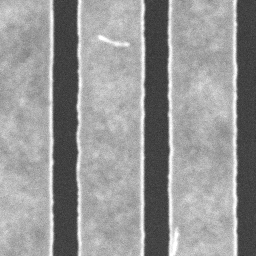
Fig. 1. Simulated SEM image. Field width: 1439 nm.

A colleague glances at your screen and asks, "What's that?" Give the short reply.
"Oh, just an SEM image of lines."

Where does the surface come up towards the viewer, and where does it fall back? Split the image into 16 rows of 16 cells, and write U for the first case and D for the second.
UUUDDUUUUDDUUUUD
UUUDDUUUUDDUUUUD
UUUDDUUUUDDUUUUD
UUUDDUUUUDDUUUUD
UUUDDUUUUDDUUUUD
UUUDDUUUUDDUUUUD
UUUDDUUUUDDUUUUD
UUUDDUUUUDDUUUUD
UUUDDUUUUDDUUUUD
UUUDDUUUUDDUUUUD
UUUDDUUUUDDUUUUD
UUUDDUUUUDDUUUUD
UUUDDUUUUDDUUUUD
UUUDDUUUUDDUUUUD
UUUDDUUUUDDUUUUD
UUUDDUUUUDDUUUUD